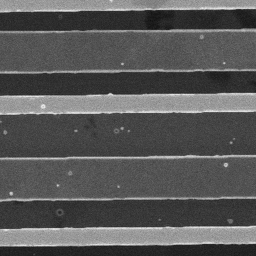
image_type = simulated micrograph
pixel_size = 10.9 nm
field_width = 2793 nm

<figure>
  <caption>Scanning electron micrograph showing lines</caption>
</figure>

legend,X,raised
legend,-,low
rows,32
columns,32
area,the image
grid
XXXXXXXXXXXXXXXXXXXXXXXXXXXXXXXX
--------------------------------
--------------------------------
--------------------------------
XXXXXXXXXXXXXXXXXXXXXXXXXXXXXXXX
XXXXXXXXXXXXXXXXXXXXXXXXXXXXXXXX
XXXXXXXXXXXXXXXXXXXXXXXXXXXXXXXX
XXXXXXXXXXXXXXXXXXXXXXXXXXXXXXXX
XXXXXXXXXXXXXXXXXXXXXXXXXXXXXXXX
--------------------------------
--------------------------------
--------------------------------
XXXXXXXXXXXXXXXXXXXXXXXXXXXXXXXX
XXXXXXXXXXXXXXXXXXXXXXXXXXXXXXXX
--------------------------------
--------------------------------
--------------------------------
--------------------------------
--------------------------------
-----------------------------XXX
XXXXXXXXXXXXXXXXXXXXXXXXXXXXXXXX
XXXXXXXXXXXXXXXXXXXXXXXXXXXXXXXX
XXXXXXXXXXXXXXXXXXXXXXXXXXXXXXXX
XXXXXXXXXXXXXXXXXXXXXXXXXXXXXXXX
XXXXXXXXXXXXXXXXXXXXXXXXXXXXXXXX
--------------------------------
--------------------------------
--------------------------------
-----------------------XXXXXXXXX
XXXXXXXXXXXXXXXXXXXXXXXXXXXXXXXX
XXXXXXXXXXXXXXXXXXXXXXXXX-------
--------------------------------